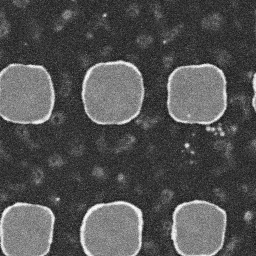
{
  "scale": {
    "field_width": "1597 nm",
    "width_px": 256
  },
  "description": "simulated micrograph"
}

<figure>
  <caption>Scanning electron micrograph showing raised bodies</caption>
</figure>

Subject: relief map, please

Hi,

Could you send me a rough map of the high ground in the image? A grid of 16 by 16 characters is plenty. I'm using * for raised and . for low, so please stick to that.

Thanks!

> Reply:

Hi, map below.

................
................
................
................
***...***..***..
***..****..***..
***..****.****..
.**...**...**...
................
................
................
................
................
***..****..***..
***..****..***..
***..****..***..